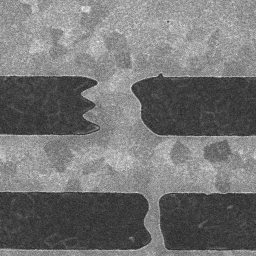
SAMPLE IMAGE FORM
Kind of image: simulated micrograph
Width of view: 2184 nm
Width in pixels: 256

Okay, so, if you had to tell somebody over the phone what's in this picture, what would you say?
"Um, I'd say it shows one or a few lines or trenches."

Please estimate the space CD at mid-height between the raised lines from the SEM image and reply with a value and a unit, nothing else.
57.9 px